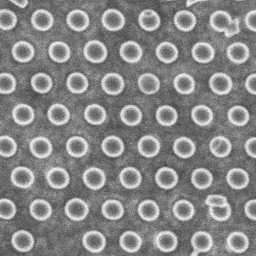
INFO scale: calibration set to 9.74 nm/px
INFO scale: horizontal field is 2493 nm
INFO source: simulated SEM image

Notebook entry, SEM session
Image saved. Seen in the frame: a regular array of raised bodies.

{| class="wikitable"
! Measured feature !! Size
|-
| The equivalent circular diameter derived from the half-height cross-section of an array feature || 0.193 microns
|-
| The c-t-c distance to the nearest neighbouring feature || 345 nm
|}